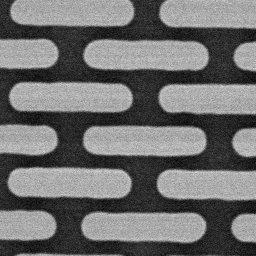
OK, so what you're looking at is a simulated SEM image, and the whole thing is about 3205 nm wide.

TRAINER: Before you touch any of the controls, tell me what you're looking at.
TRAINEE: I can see groups of lines, slits or small figures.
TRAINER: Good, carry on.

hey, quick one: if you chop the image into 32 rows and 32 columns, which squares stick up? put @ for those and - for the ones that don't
--@@@@@@@@@@@@@@----@@@@@@@@@@@@
-@@@@@@@@@@@@@@@@---@@@@@@@@@@@@
--@@@@@@@@@@@@@@----@@@@@@@@@@@@
--------------------------------
--------------------------------
@@@@@@@----@@@@@@@@@@@@@@------@
@@@@@@@----@@@@@@@@@@@@@@@---@@@
@@@@@@@----@@@@@@@@@@@@@@@---@@@
------------@@@@@@@@@@@@@-----@@
--------------------------------
--@@@@@@@@@@@-------------------
-@@@@@@@@@@@@@@@----@@@@@@@@@@@@
-@@@@@@@@@@@@@@@----@@@@@@@@@@@@
--@@@@@@@@@@@@@@----@@@@@@@@@@@@
--------------------------------
--------------------------------
@@@@@@@----@@@@@@@@@@@@@@-----@@
@@@@@@@----@@@@@@@@@@@@@@@---@@@
@@@@@@@----@@@@@@@@@@@@@@@---@@@
-------------------------------@
--------------------------------
--@@@@@@@@@@@@@@-----@@@@@@@@---
-@@@@@@@@@@@@@@@----@@@@@@@@@@@@
-@@@@@@@@@@@@@@@----@@@@@@@@@@@@
-----@@@-@@@@@@------@@@@@@@@@@@
--------------------------------
@@@@@@--------------------------
@@@@@@@---@@@@@@@@@@@@@@@----@@@
@@@@@@@---@@@@@@@@@@@@@@@@---@@@
@@@@@@-----@@@@@@@@@@@@@@----@@@
--------------------------------
--------------------------------